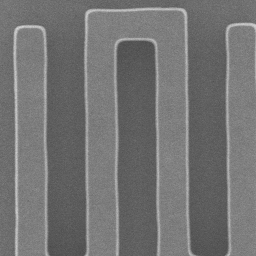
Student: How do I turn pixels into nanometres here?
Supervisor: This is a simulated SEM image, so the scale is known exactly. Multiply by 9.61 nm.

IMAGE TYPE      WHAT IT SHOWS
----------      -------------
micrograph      groups of lines, slits or small figures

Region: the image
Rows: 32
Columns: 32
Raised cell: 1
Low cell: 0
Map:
00000000000000000000000000000000
00000000000111111111111000000000
00000000000111111111111000000000
00111000000111111111111000000111
00111100000111111111111000001111
00111100000111100001111000001111
00111100000111000000111000001111
00111100000111000000111000001111
00111100000111000000111000001111
00111100000111000000111000001111
00111100000111000000111000001111
00111100000111000000111000001111
00111100000111100000111000001111
00111100000111100000111000001111
00111100000111100000111000001111
00111100000111100000111000001111
00111100000111100000111000001111
00111100000111100000111000001111
00111100000111100000111000000111
00111100000111100000111000001111
00111100000111100000111000001111
00111100000111100000111000001111
00111100000111100000111000000111
00111100000111100000111000000111
00111100000111100000111000000111
00111100000111100000111000000111
00111100000111100000111000000111
00111100000111100000111000000111
00111100000111100000111100000111
00111100000111100000111100000111
00111100000111100000111100000111
00111100000111100000111100000111